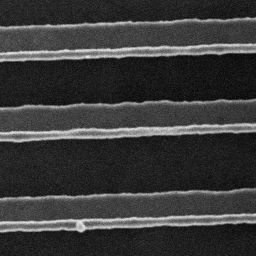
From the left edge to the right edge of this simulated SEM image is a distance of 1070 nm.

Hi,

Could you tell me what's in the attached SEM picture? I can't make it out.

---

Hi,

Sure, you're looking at lines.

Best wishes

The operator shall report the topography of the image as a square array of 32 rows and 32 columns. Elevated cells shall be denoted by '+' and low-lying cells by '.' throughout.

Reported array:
................................
................................
.......................++.++++++
++++++++++++++++++++++++++++++++
++++++++++++++++++++++++++++++++
++++++++++++++++++++++++++++++++
++++++++++++++++++++++++++++++++
+++.............................
................................
................................
................................
................................
...........................+...+
++++++++++++++++++++++++++++++++
++++++++++++++++++++++++++++++++
++++++++++++++++++++++++++++++++
+++++++++++++++++++++++++++..+..
++++............................
................................
................................
................................
................................
................................
................................
...........+++++++++++++++++++++
++++++++++++++++++++++++++++++++
++++++++++++++++++++++++++++++++
++++++++++++++++++++++++++++++++
++++++++++++++..................
................................
................................
................................